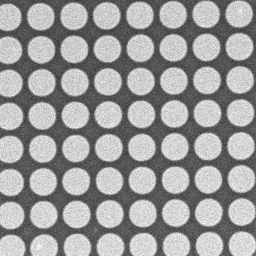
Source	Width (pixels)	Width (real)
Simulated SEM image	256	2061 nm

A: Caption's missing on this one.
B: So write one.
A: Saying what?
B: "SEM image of an array of small figures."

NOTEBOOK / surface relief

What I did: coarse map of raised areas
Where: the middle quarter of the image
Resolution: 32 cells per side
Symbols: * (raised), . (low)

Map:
................................
.***......**......***.....***...
*****...******..******...*****..
******..******..******..*******.
******..******..******..*******.
******..******..******..*******.
******..******..******...*****..
.***......**......**.......*....
................................
..........**......***.....***...
*****...******...*****...*****..
******..******..*******.*******.
******..******..*******.*******.
******..******..*******.*******.
******..******...*****...*****..
.****....****.....***.....***...
................................
...........................*....
.****....****....*****...*****..
******..******..******...******.
******..*******.*******..******.
******..*******.*******..******.
******..******..******...******.
.****....****....****.....***...
................................
................................
..***....****.....****....****..
******..******...******..******.
******..*******.*******..******.
******..*******.*******..******.
******..******...******..******.
******...*****...*****....****..